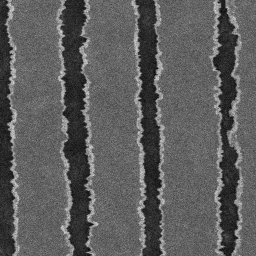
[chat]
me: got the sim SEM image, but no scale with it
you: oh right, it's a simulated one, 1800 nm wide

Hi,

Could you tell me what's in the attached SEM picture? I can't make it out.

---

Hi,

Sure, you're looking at one or a few lines or trenches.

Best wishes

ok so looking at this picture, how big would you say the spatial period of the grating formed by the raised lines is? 0.527 um